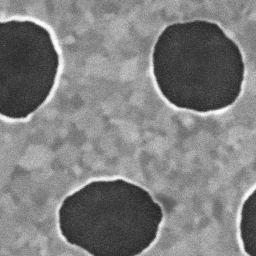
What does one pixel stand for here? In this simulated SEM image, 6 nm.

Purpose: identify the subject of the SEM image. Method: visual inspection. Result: holes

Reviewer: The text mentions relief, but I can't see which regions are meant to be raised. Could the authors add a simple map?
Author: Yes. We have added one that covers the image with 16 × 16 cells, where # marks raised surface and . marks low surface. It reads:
################
...########..###
...#######....##
....######.....#
....######.....#
...#######.....#
...########...##
################
################
################
################
#####...########
####......#####.
####......#####.
####......#####.
#####....######.